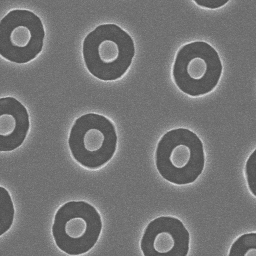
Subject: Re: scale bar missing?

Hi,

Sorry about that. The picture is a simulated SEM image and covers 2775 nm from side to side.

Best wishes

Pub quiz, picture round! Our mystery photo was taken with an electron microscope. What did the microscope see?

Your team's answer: ring-shaped grooves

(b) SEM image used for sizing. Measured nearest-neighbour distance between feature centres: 960 nanometers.